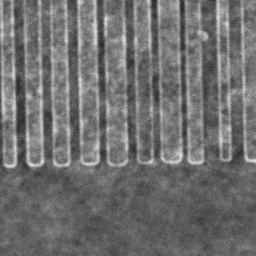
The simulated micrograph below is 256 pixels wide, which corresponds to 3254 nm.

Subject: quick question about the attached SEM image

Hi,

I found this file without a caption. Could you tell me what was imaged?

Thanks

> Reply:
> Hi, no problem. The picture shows parallel lines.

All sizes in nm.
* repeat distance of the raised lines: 343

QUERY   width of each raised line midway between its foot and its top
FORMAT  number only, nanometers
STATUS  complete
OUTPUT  197